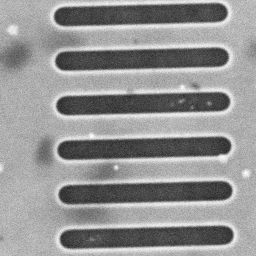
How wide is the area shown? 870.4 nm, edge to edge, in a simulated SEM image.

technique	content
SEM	groups of lines, slits or small figures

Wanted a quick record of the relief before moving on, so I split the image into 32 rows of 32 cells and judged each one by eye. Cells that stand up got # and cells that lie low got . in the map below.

#####################.......####
#######.....................####
#######.....................####
################################
################################
################################
########....................####
#######......................###
#######................#########
################################
################################
########################....####
#######......................###
#######.....................####
################################
################################
################################
#########....................###
#######......................###
#######....................#####
################################
################################
################################
########.....................###
#######......................###
########........################
################################
################################
############.................###
########.....................###
########....................####
################################